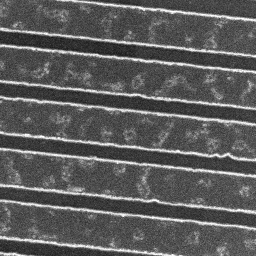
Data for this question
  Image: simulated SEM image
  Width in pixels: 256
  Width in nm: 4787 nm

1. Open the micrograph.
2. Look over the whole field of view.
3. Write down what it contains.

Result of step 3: parallel lines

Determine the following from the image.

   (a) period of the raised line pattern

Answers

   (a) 968 nm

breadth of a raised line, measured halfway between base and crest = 679 nanometres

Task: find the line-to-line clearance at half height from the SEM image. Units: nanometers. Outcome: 293